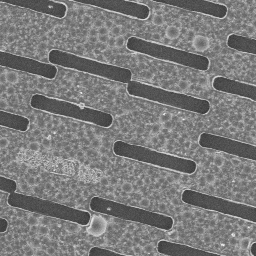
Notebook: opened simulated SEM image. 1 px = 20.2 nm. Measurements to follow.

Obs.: holes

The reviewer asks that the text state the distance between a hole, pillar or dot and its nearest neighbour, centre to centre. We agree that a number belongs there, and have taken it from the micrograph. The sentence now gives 78.1 pixels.